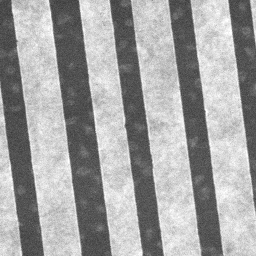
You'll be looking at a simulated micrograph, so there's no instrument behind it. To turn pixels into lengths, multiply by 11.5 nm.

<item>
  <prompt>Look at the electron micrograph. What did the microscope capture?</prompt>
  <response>parallel lines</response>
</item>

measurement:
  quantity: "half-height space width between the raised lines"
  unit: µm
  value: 0.268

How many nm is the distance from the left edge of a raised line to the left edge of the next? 680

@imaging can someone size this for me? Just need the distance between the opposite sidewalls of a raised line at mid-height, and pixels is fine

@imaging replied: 35.7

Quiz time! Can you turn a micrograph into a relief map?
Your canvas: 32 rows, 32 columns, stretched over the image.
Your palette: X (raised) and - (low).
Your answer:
--XXXX----XXXX--XXXXX---XXXXX--X
--XXXX----XXXX---XXXX---XXXXX--X
--XXXX----XXXX---XXXX---XXXXX---
--XXXX----XXXX---XXXX---XXXXX---
--XXXXX----XXX---XXXXX--XXXXX---
--XXXXX----XXX---XXXXX---XXXX---
--XXXXX----XXX---XXXXX---XXXX---
--XXXXX----XXXX--XXXXX---XXXX---
---XXXX----XXXX---XXXX---XXXXX--
---XXXX----XXXX---XXXX---XXXXX--
---XXXX----XXXX---XXXX---XXXXX--
---XXXXX---XXXX---XXXX---XXXXX--
---XXXXX----XXX---XXXXX--XXXXX--
---XXXXX----XXX---XXXXX---XXXX--
---XXXXX----XXX---XXXXX---XXXX--
X--XXXXX----XXXX--XXXXX---XXXX--
X---XXXX----XXXX---XXXX---XXXXX-
X---XXXX----XXXX---XXXX---XXXXX-
X---XXXX----XXXX---XXXX---XXXXX-
X---XXXXX---XXXX---XXXX---XXXXX-
X---XXXXX----XXX---XXXXX---XXXX-
X---XXXXX----XXX---XXXXX---XXXX-
XX--XXXXX----XXXX--XXXXX---XXXX-
XX---XXXX----XXXX--XXXXX---XXXXX
XX---XXXX----XXXX---XXXX---XXXXX
XX---XXXX----XXXX---XXXX---XXXXX
XX---XXXX----XXXX---XXXX---XXXXX
XX---XXXXX---XXXX---XXXXX--XXXXX
XX---XXXXX----XXX---XXXXX---XXXX
XX---XXXXX----XXX---XXXXX---XXXX
XXX--XXXXX----XXXX--XXXXX---XXXX
XXX---XXXX----XXXX--XXXXX---XXXX